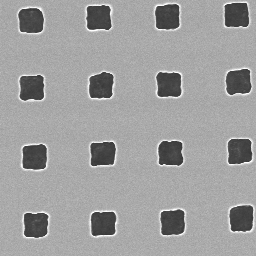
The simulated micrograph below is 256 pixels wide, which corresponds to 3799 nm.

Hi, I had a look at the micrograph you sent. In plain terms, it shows a regular array of holes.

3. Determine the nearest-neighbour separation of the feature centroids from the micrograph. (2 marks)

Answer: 1000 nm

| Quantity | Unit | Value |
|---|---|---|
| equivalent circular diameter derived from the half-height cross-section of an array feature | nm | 395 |